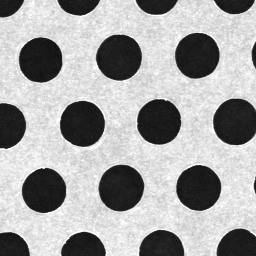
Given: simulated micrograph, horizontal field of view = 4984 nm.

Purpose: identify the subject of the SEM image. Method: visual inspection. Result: a regular array of holes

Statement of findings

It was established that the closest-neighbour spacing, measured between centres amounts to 1480 nanometers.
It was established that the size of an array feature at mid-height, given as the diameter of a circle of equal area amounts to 886 nanometres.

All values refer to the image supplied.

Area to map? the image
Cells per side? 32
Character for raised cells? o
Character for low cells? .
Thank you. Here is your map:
...oooo.....ooooo.....ooooo.....
..oooooo...ooooooo...ooooooo..oo
oooooooooooooooooooooooooooooooo
oooooooooooooooooooooooooooooooo
oooooooooooooo..ooooooo...oooooo
ooo....oooooo....ooooo.....ooooo
oo......oooo......oooo.....ooooo
oo......oooo......oooo.....ooooo
ooo.....oooo.....ooooo.....ooooo
ooo....oooooo....oooooo...oooooo
oooooooooooooooooooooooooooooooo
oooooooooooooooooooooooooooooooo
ooooooooooooooooooo..oooooooo..o
..oooooo....oooooo....ooooo.....
...ooooo.....oooo......oooo.....
...oooo......oooo......oooo.....
...ooooo.....oooo.....ooooo.....
...ooooo....oooooo....oooooo...o
.ooooooooooooooooooooooooooooooo
oooooooooooooooooooooooooooooooo
oooooooooooooooooooooooooooooooo
oooo...oooooo....oooooo....ooooo
ooo.....ooooo.....oooo......oooo
ooo.....oooo......oooo......oooo
ooo.....oooo......oooo.....ooooo
ooo.....ooooo....oooooo....ooooo
ooooo.oooooooooooooooooooooooooo
oooooooooooooooooooooooooooooooo
oooooooooooooooooooooooooooooooo
...oooooo...oooooo....oooooo....
...ooooo.....ooooo.....oooo.....
....oooo.....oooo......oooo.....